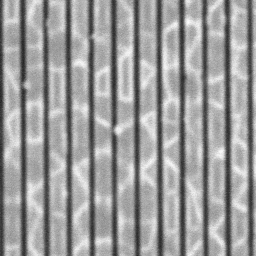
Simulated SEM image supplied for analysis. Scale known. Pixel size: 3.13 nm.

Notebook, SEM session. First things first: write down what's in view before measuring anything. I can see parallel lines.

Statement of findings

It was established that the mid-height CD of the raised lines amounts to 0.0521 micrometres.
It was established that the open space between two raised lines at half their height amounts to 20 nm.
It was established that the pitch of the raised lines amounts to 71.1 nm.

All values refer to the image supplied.